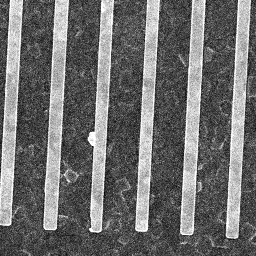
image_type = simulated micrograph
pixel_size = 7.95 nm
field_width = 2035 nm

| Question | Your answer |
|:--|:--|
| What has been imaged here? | parallel lines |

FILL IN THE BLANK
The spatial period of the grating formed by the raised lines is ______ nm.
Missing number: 362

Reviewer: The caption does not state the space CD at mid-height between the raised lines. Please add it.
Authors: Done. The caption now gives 262 nanometres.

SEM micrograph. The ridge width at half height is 97.3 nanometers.